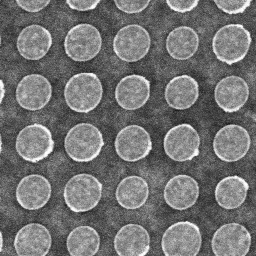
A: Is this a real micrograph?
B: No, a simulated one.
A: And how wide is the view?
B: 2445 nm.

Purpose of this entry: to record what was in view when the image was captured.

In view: a regular array of raised bodies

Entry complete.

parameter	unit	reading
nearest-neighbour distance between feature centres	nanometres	469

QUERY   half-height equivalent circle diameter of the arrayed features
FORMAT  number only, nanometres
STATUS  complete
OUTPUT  335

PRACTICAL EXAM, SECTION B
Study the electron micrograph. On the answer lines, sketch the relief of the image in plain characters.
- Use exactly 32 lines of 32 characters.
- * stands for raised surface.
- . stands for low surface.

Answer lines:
..****..****..****...****..****.
................*.....*.....**..
................................
...**....***....**....*.....**..
..****..*****..****..****..****.
..****..*****.*****..****..****.
...***..****..****...***...****.
.........**.....*...........**..
................................
....*....***....**..............
..****..*****..****..****..****.
*.****..*****..****..****..****.
..****..*****..***...***...****.
...**....***....*.....*.....**..
................................
................................
...***...***...***...***...****.
..*****.*****..****..****..****.
..*****.*****..****..****..****.
...***...***...***...***...***..
................................
................................
...***...***...***...***....**..
..****..*****..***...****..****.
..****..*****..***...****..****.
...***..****...***...***....**..
................................
................................
...***....*....***...****...***.
..****...***..*****.*****..****.
..****..****..*****.*****..****.
..****...***...***...****..****.